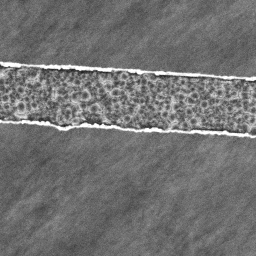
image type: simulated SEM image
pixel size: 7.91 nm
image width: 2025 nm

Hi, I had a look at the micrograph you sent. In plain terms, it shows one or a few lines or trenches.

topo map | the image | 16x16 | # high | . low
................
................
................
................
#########.......
################
################
#.##############
................
................
................
................
................
................
................
................